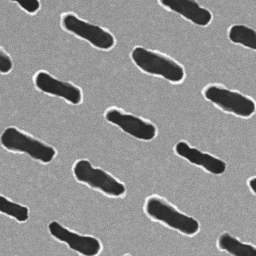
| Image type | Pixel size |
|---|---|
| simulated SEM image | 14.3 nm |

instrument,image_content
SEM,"a regular array of holes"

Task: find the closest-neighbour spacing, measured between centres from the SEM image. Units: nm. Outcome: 920